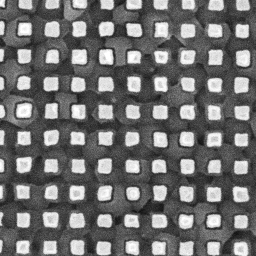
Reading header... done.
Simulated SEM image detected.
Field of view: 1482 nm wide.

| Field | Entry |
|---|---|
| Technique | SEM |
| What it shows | a regular array of raised bodies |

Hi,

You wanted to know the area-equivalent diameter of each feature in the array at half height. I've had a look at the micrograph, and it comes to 84.7 nm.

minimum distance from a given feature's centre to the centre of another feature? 154 nanometers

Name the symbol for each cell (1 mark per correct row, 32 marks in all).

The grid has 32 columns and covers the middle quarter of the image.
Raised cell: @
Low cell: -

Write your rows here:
--------------------------------
--------------------------------
--------------------------------
---------@@-----@@@----@@-------
--@@@----@@@----@@@----@@----@@@
--@@@----@@@----@@@----@@@----@@
--@@@----@@@----@@@----@@@----@@
--------------------------------
--------------------------------
--------------------------------
--@@@----@@@----@@------@-------
--@@@----@@@----@@@---@@@@---@@@
--@@@----@@@----@@@---@@@@---@@@
---@@-----@@----@@@----@@@----@@
--------------------------------
--------------------------------
--------------------------------
--@@@----@@@----@@----@@@----@@@
--@@@----@@@----@@@---@@@----@@@
--@@@----@@@----@@@----@@@---@@@
-----------------------@@-------
--------------------------------
--------------------------------
--------------------------------
--@@@----@@@----@@@---@@@----@@@
--@@@----@@@----@@@---@@@----@@@
--@@@---@@@@----@@@---@@@----@@@
--------------------------------
--------------------------------
--------------------------------
----------@@--------------------
--@@@----@@@----@@@----@@@---@@@